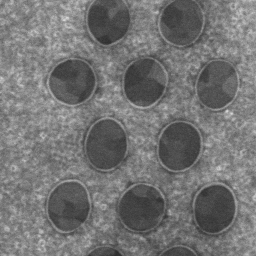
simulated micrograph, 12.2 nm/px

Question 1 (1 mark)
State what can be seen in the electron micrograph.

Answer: a regular array of raised bodies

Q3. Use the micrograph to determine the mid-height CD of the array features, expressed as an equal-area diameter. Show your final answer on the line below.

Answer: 0.576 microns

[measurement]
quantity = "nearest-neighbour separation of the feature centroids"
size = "876 nm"